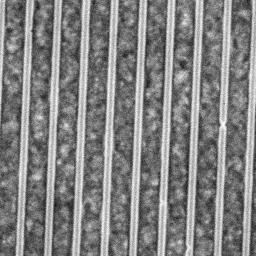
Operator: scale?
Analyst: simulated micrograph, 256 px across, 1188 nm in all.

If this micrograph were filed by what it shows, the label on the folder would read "parallel lines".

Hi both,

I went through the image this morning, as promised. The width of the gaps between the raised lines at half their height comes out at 102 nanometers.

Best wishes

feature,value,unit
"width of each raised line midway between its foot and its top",0.0284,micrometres